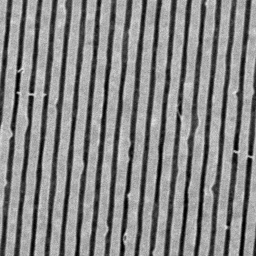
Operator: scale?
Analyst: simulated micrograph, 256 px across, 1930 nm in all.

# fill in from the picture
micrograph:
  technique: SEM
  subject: parallel lines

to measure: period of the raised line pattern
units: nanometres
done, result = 112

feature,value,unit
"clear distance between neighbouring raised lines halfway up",5.23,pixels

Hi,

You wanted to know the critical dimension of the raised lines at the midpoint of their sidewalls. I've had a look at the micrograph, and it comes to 0.0714 µm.